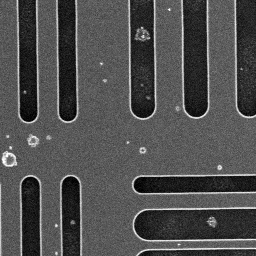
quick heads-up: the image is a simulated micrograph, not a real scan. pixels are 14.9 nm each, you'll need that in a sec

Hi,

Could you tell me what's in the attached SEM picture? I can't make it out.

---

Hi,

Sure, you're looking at groups of lines, slits or small figures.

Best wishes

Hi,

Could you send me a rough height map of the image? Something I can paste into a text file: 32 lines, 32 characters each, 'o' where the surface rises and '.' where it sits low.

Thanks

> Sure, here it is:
oo...oo..ooooooo...oooo...ooo...
oo...oo..ooooooo...oooo...ooo...
oo...oo...oooooo...oooo...ooo...
oo...oo...oooooo...oooo...ooo...
oo...oo...oooooo...oooo...ooo...
oo...oo...oooooo...oooo...ooo...
oo...oo...oooooo...oooo...ooo...
oo...oo...oooooo...oooo...oooo..
oo...oo...oooooo...oooo...oooo..
oo...oo...oooooo...oooo...oooo..
oo...oo...oooooo...oooo...oooo..
oo...oo...oooooo...oooo...oooo..
oo...oo...oooooo...oooo...oooo..
oo...oo...oooooo...oooo...oooo..
ooo..oo..oooooooo..ooooo.oooooo.
oooooooooooooooooooooooooooooooo
oooooooooooooooooooooooooooooooo
oooooooooooooooooooooooooooooooo
oooooooooooooooooooooooooooooooo
oooooooooooooooooooooooooooooooo
oooooooooooooooooooooooooooooooo
oooooooooooooooooooooooooooooooo
ooo..ooo..ooooooo...............
ooo..ooo..ooooooo...............
ooo..ooo..oooooooooooooooooooooo
ooo..ooo..oooooooooooooooooooooo
ooo..ooo..oooooooo..............
ooo..ooo..ooooooo...............
ooo..ooo..ooooooo...............
ooo..ooo..ooooooo...............
ooo..ooo..oooooooooooooooooooooo
ooo..ooo..oooooooo..............